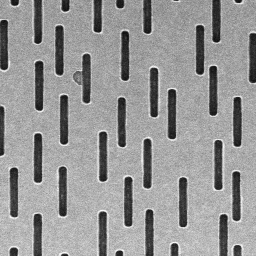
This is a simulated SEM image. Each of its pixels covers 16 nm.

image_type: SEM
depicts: a regular array of holes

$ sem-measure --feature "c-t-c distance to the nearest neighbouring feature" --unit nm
637